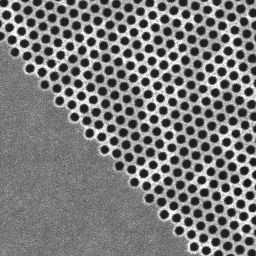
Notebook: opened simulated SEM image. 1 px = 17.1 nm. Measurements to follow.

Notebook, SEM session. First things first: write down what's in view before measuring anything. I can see a regular array of holes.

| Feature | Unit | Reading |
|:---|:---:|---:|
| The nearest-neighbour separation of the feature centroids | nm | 214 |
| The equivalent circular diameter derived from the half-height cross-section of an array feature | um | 0.166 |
